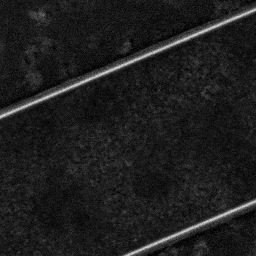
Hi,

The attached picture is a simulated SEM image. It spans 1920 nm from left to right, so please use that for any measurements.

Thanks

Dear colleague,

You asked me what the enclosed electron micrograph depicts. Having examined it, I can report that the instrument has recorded one or a few lines or trenches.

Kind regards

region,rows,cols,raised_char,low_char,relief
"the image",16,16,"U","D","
DDDDDDDDDDDDDDDD
DDDDDDDDDDDDDDUU
DDDDDDDDDDDUUUUU
DDDDDDDDDUUUUUUU
DDDDDDDUUUUUUUUU
DDDDUUUUUUUUUUUU
DDUUUUUUUUUUUUUU
UUUUUUUUUUUUUUUU
UUUUUUUUUUUUUUUU
UUUUUUUUUUUUUUUU
UUUUUUUUUUUUUUUU
UUUUUUUUUUUUUUUU
UUUUUUUUUUUUUUUU
UUUUUUUUUUUUUUDD
UUUUUUUUUUUDDDDD
UUUUUUUUUDDDDDDD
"